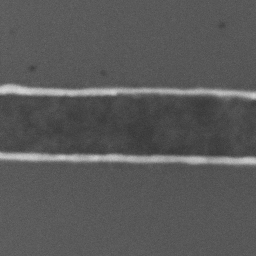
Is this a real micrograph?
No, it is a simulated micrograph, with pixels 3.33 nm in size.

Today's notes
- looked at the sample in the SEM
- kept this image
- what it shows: one or a few lines or trenches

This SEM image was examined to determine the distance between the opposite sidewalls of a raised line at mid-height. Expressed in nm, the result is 232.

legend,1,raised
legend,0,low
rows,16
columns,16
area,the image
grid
0000000000000000
0000000000000000
0000000000000000
0000000000000000
0000000000000000
1000000000000000
1111111111111111
1111111111111111
1111111111111111
1111111111111111
0000000000000000
0000000000000000
0000000000000000
0000000000000000
0000000000000000
0000000000000000